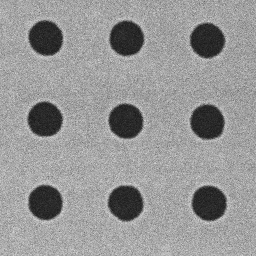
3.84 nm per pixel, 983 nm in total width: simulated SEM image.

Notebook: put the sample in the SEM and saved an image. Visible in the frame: a regular array of holes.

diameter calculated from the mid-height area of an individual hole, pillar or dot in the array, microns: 0.135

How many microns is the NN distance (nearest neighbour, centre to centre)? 0.31